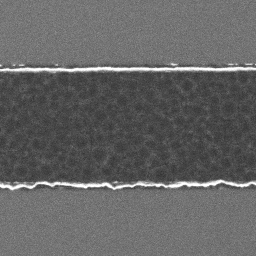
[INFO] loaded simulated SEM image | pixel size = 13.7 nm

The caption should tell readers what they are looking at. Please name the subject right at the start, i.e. one or a few lines or trenches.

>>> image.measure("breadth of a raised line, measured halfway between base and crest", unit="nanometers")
1610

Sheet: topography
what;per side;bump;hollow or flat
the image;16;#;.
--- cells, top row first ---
................
................
................
................
################
################
################
################
################
################
################
#############.##
................
................
................
................